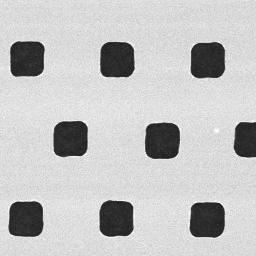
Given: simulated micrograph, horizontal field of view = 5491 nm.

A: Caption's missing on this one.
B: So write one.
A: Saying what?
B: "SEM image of a regular array of holes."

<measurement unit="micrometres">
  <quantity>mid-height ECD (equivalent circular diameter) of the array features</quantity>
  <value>0.82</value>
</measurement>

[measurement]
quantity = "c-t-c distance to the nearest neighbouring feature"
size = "1940 nm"